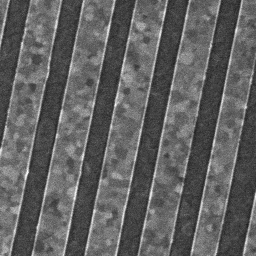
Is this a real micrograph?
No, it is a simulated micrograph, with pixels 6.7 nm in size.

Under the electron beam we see parallel lines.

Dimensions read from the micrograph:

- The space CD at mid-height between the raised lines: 21.3 px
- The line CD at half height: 29.9 pixels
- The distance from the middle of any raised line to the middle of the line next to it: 343 nm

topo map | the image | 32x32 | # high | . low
#...####..####...####...####..##
#...###...####...####..####...##
#..####...####...###...####...##
...####...####..####...####...##
...####...###...####...####..###
...####..####...####...###...###
...###...####...####..####...###
..####...####...###...####...###
..####...####..####...####...###
..####...###...####...####..####
..####..####...####...###...###.
..###...####...####..####...###.
.####...####..####...####...###.
.####...####..####...####...###.
.####...###...####...####..####.
.####..####...####...###...###..
.#####.####...####..####...###..
######.####...###...####...###..
####...####..####...####...###..
####...###...####...####..####..
####..####...####...###...###...
###...####...####..####...###...
###...####...###...####...###...
###...####..####...####...###...
###...###...####...####..####...
###..####...####...###...###....
##...####...####..####...###....
##...####...###...####...###...#
##...####..####...####...###...#
##..####...####...####..###....#
##..####...####...###...###....#
#...####...####..####...###....#